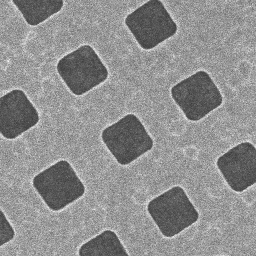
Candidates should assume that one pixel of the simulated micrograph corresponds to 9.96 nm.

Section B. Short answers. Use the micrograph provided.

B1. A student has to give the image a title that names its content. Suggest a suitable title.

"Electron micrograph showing holes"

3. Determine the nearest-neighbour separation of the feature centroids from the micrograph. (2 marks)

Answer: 823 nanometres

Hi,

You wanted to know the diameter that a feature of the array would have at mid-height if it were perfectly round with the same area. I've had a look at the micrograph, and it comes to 456 nm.